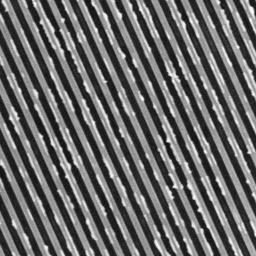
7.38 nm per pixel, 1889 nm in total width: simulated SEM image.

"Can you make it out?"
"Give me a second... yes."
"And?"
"parallel lines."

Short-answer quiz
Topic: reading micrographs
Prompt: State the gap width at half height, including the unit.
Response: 0.0513 um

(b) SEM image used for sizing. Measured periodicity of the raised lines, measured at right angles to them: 100 nanometres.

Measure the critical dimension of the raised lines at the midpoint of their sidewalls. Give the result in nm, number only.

50.5